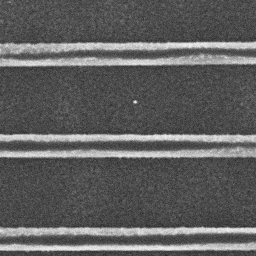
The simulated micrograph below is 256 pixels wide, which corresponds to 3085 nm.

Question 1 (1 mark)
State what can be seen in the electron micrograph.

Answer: lines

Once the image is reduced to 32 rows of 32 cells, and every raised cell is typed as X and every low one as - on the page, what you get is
--------------------------------
--------------------------------
--------------------------------
--------------------------------
--------------------------------
--------------------------------
XXXXXXXXXXXXXXXXXXXXXXXXXXXXXXXX
XXXXXXXXXXXXXXXXXXXXXXXXXXXXXXXX
--------------------------------
--------------------------------
--------------------------------
--------------------------------
--------------------------------
--------------------------------
--------------------------------
--------------------------------
--------------------------------
XXXXXXXXXXXXXXXXXXXXXXXXXXXXXXXX
XXXXXXXXXXXXXXXXXXXXXXXXXXXXXXXX
--------------------------------
--------------------------------
--------------------------------
--------------------------------
--------------------------------
--------------------------------
--------------------------------
--------------------------------
--------------------------------
--------------------------------
XXXXXXXXXXXXXXXXXXXXXXXXXXXXXXXX
XXXXXXXXXXXXXXXXXXXXXXXXXXXXXXXX
--------------------------------